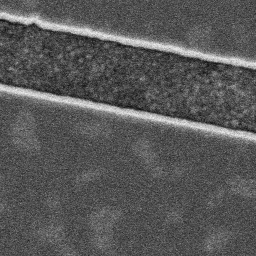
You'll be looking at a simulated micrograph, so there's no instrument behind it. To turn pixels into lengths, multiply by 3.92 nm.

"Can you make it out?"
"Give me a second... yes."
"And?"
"one or a few lines or trenches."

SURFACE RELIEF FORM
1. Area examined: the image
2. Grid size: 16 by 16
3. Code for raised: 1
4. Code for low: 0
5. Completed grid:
1111111111111111
0001111111111111
0000000111111111
0000000000001111
0000000000000000
0000000000000000
1111110000000000
1111111111100000
1111111111111111
1111111111111111
1111111111111111
1111111111111111
1111111111111111
1111111111111111
1111111111111111
1111111111111111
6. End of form